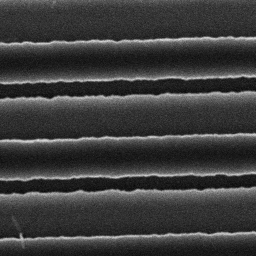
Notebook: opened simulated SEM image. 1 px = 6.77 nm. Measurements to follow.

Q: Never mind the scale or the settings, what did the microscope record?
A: lines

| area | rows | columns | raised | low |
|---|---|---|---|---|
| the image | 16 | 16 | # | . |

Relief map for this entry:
................
................
.........#######
################
################
................
................
................
...........#####
################
################
................
................
................
...............#
################